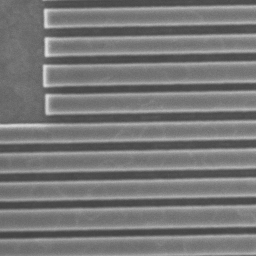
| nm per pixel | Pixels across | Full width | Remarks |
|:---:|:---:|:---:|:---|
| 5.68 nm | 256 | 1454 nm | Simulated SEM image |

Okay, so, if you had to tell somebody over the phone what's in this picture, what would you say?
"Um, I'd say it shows parallel lines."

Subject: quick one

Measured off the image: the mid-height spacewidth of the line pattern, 56.8 nm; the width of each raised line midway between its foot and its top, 109 nm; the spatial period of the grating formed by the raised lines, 163 nm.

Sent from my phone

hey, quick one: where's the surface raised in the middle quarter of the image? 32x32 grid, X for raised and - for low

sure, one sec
XXXXXXXXXXXXXXXXXXXXXXXXXXXXXXXX
XXXXXXXXXXXXXXXXXXXXXXXXXXXXXXXX
XXXXXXXXXXXXXXXXXXXXXXXXXXXXXXXX
XXXXXXXXXXXXXXXXXXXXXXXXXXXXXXXX
XXXXXXXXXXXXXXXXXXXXXXXXXXXXXXXX
--------------------------------
--------------------------------
------------XXXXXXXXXXXXXXXXXXXX
XXXXXXXXXXXXXXXXXXXXXXXXXXXXXXXX
XXXXXXXXXXXXXXXXXXXXXXXXXXXXXXXX
XXXXXXXXXXXXXXXXXXXXXXXXXXXXXXXX
XXXXXXXXXXXXXXXXXXXXXXXXXXXXXXXX
--------------------------------
--------------------------------
--------------------------------
XXXXXXXXXXXXXXXXXXXXXXXXXXXXXXXX
XXXXXXXXXXXXXXXXXXXXXXXXXXXXXXXX
XXXXXXXXXXXXXXXXXXXXXXXXXXXXXXXX
XXXXXXXXXXXXXXXXXXXXXXXXXXXXXXXX
XXX-----------------------------
--------------------------------
--------------------------------
XXXXXXXXXXXXXXXXXXXXXXXXXXXXXXXX
XXXXXXXXXXXXXXXXXXXXXXXXXXXXXXXX
XXXXXXXXXXXXXXXXXXXXXXXXXXXXXXXX
XXXXXXXXXXXXXXXXXXXXXXXXXXXXXXXX
XXXXXXXXXXXXXXXXXXX-------------
--------------------------------
--------------------------------
----XXXXXXXXXXXXXXXXXXXXXXXXXXXX
XXXXXXXXXXXXXXXXXXXXXXXXXXXXXXXX
XXXXXXXXXXXXXXXXXXXXXXXXXXXXXXXX